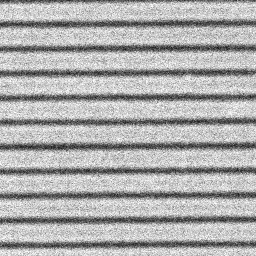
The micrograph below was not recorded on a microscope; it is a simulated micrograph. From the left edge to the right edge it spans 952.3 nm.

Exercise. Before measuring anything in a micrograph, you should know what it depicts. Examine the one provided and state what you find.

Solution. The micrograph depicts parallel lines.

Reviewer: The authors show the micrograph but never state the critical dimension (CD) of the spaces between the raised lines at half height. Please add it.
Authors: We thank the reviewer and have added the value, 29.3 nanometres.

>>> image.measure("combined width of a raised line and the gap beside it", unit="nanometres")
91.4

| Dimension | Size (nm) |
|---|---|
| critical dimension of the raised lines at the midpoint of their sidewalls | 62.4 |